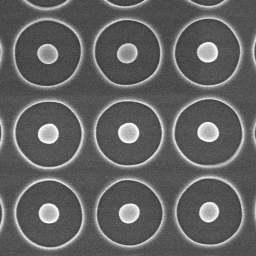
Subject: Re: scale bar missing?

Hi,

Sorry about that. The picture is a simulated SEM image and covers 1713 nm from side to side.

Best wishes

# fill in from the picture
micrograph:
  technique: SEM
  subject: an array of small figures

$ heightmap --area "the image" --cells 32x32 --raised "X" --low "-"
XXXX----XXXXXX---XXXXXXXX--XXXXX
XXXXXXXXXXXXXXXXXXXXXXXXXXXXXXXX
XXXXX-XXXXXXXXX-XXXXXXXXX--XXXXX
XXX------XXXX------XXXX------XXX
XX--------XX-------XXX-------XXX
XX--------XX--------XX---XX---XX
XX---XX---XX---XX---XX---XX---XX
XX---XX---XX---XX---XX---XX---XX
XX--------XX--------XX--------XX
XXX------XXXX------XXXX------XXX
XXXX---XXXXXXX---XXXXXXXX--XXXXX
XXXXXXXXXXXXXXXXXXXXXXXXXXXXXXXX
XXXXXXXXXXXXXXXXXXXXXXXXX--XXXXX
XXX------XXXX------XXXX------XXX
XX-------XXXX-------XX--------XX
XX--------XX--------XX---XX---XX
XX--------XX--------XX---XX---XX
XX--------XX--------XX---XX---XX
XX--------XX--------XX--------XX
XXX------XXXX------XXXX------XXX
XXXX----XXXXXXX---XXXXXX----XXXX
XXXXXXXXXXXXXXXXXXXXXXXXXXXXXXXX
XXXXXXXXXXXXXXX-XXXXXXXXX---XXXX
XXX------XXXXX-----XXXX------XXX
XXX-------XXX-------XXX-------XX
XX--------XX--------XX--------XX
XX---XX---XX--------XX--------XX
XX---XX---XX--------XX--------XX
XX--------XX--------XXX-------XX
XXX------XXXX------XXXX------XXX
XXXX----XXXXXXX---XXXXXXX--XXXXX
XXXXXXXXXXXXXXXXXXXXXXXXXXXXXXXX